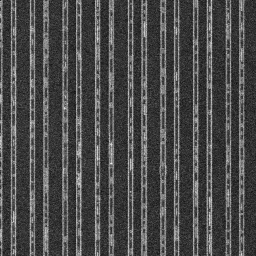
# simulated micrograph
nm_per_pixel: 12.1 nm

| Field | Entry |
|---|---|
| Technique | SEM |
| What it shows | parallel lines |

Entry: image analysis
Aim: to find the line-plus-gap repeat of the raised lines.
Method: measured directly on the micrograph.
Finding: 0.197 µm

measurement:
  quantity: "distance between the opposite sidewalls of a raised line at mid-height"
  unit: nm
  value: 51.4